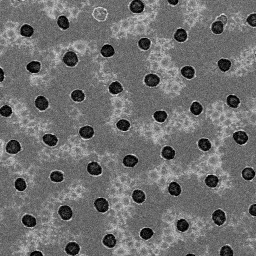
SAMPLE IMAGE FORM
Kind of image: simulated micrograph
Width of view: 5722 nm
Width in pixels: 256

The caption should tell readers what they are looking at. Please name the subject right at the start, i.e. a regular array of holes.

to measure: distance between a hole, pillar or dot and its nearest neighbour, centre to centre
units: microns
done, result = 0.827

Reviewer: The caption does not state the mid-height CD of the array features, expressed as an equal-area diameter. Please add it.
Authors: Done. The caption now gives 312 nanometers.